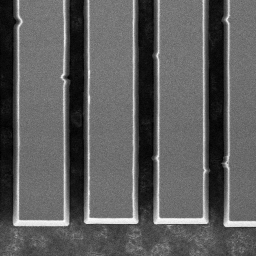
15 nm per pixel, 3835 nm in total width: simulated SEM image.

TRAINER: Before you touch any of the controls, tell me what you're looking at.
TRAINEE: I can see one or a few lines or trenches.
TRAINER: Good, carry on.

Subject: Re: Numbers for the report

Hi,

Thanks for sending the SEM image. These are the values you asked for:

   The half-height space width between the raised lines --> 0.309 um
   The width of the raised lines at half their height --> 747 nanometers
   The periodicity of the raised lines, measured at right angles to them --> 1.04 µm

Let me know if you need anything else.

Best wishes